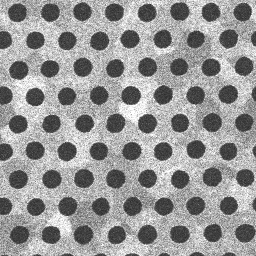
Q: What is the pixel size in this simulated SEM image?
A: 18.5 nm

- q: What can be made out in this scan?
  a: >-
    a regular array of holes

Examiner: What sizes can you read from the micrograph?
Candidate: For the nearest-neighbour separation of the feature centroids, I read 578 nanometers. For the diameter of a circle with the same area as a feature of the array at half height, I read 354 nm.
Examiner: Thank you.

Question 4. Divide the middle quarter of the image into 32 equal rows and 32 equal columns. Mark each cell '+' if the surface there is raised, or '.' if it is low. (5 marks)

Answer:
++.....++++....++++....+++.....+
++.....+++.....++++....++++....+
+++...+++++....++++....++++...++
++++++++++++.+++++++++++++++++++
++++++++++++++++++++++++++++++++
++++++++..++++++.+++++++..++++++
...++++....++++....++++....++++.
...+++.....+++.....+++.....++++.
...++++....+++.....+++.....++++.
...++++...+++++....++++...+++++.
++++++++++++++++++++++++++++++++
++++++++++++++++++++++++++++++++
++++++++++++..++++++..++++++.+++
+++....++++....++++....++++....+
+++....++++....++++....++++....+
+++.....+++....++++....++++....+
+++....++++....++++....++++....+
++++++++++++++++++++++++++++++++
++++++++++++++++++++++++++++++++
.+++++++++++++++..++++++..++++++
...++++....++++....++++....++++.
...+++.....++++....++++....++++.
...+++.....++++....++++....++++.
...++++...+++++....++++...++++++
++++++++++++++++++++++++++++++++
++++++++++++++++++++++++++++++++
++++..++++++..++++++..++++++.+++
+++....++++....++++....++++....+
+++.....++......+++....++++....+
++.....++++....++++....++++....+
+++....++++....+++++..+++++....+
++++++++++++++++++++++++++++++++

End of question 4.